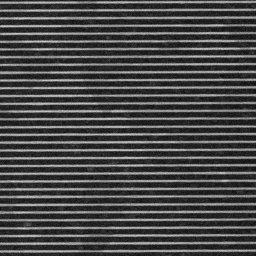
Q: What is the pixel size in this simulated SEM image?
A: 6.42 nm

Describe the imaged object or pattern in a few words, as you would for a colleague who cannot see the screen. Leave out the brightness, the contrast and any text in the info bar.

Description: parallel lines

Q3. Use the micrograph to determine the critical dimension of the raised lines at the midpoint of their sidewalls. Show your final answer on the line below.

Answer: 9.6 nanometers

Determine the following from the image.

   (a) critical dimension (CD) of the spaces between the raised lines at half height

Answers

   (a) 39.3 nm